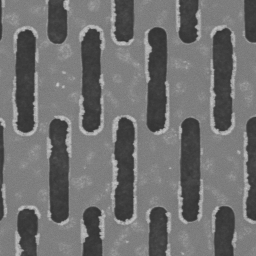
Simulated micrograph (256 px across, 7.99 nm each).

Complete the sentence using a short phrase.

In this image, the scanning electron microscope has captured holes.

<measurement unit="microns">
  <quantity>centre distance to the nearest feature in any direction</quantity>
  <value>0.525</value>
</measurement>